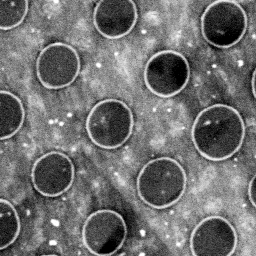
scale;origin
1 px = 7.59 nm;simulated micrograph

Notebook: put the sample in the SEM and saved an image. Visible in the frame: raised bodies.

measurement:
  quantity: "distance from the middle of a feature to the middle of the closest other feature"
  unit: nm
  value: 577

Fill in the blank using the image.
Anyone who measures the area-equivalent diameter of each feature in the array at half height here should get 45.6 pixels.